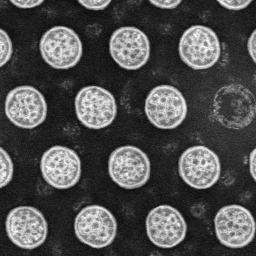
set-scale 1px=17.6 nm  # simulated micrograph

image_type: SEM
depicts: a regular array of raised bodies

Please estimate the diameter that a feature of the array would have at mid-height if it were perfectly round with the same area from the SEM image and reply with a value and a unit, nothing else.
709 nm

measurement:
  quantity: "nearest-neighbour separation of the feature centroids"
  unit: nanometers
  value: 1200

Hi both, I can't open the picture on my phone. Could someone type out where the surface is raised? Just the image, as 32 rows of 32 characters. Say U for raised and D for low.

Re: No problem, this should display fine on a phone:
DDUUUDDDDDUUUDDDDDDUUUDDDDDDUUUD
DDDDDDDDDDDDDDDDDDDDDDDDDDDDDDDD
DDDDDDDDDDDDDDDDDDDDDDDDDDDDDDDD
DDDDDDDUDDDDDDDDDDDDDDDDUUDDDDDD
UDDDDDUUUDDDDDUUUUDDDDDUUUUDDDDU
UDDDDUUUUUDDDDUUUUUDDDDUUUUDDDDU
UDDDDUUUUUDDDDUUUUUDDDDUUUUDDDDU
UDDDDDUUUUDDDDUUUUDDDDDUUUUDDDDD
DDDDDDDDDDDDDDDDUDDDDDDDDDDDDDDD
DDDDDDDDDDDDDDDDDDDDDDDDDDDDDDDD
DDDDDDDDDDDDDDDDDDDDDDDDDDDDDDDD
DDUUUDDDDDUUUDDDDDDUUUDDDDDDDDDD
DUUUUDDDDDUUUUDDDDUUUUUDDDDDDDDD
DUUUUUDDDDUUUUDDDDUUUUUDDDDDDDDD
DUUUUUDDDDUUUUDDDDUUUUUDDDDDDDDD
DDUUUDDDDDDUUUDDDDDUUUDDDDDDDDDD
DDDDDDDDDDDDDDDDDDDDDDDDDDDDDDDD
DDDDDDDDDDDDDDDDDDDDDDDDDDDDDDDD
DDDDDDDUDDDDDDDUDDDDDDDDUUDDDDDD
UDDDDUUUUUDDDDUUUUDDDDDUUUUDDDDD
UDDDDUUUUUDDDDUUUUUDDDDUUUUDDDDU
UDDDDUUUUUDDDDUUUUUDDDDUUUUDDDDU
UDDDDDUUUUDDDDUUUUDDDDDUUUUDDDDD
DDDDDDDUDDDDDDDDDDDDDDDDDUDDDDDD
DDDDDDDDDDDDDDDDDDDDDDDDDDDDDDDD
DDDDDDDDDDDDDDDDDDDDDDDDDDDDDDDD
DDUUUDDDDDUUUUDDDDDUUUDDDDDUUUUD
DUUUUDDDDUUUUUDDDDUUUUUDDDDUUUUU
DUUUUUDDDUUUUUDDDDUUUUUDDDDUUUUU
DUUUUUDDDDUUUUDDDDDUUUUDDDDUUUUU
DDUUUDDDDDDUUDDDDDDUUUDDDDDDUUUD
DDDDDDDDDDDDDDDDDDDDDDDDDDDDDDDD